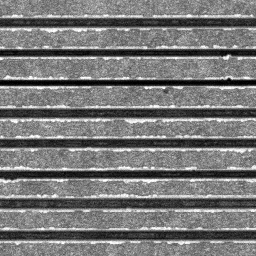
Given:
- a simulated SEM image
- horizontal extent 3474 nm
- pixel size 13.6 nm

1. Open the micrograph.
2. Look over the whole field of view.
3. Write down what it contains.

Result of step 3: parallel lines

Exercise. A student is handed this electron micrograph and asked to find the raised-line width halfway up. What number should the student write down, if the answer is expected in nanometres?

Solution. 294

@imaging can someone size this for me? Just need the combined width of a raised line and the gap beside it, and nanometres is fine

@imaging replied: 410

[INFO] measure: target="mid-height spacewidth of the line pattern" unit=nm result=129